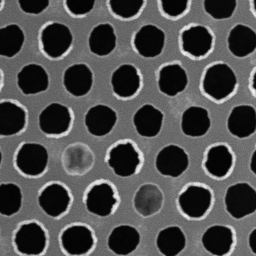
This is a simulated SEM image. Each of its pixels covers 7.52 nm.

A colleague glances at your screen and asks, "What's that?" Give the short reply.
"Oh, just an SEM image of a regular array of holes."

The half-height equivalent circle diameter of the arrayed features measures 0.229 µm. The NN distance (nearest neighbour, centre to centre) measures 345 nm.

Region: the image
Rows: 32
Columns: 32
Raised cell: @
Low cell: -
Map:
@@----@@----@@----@@---@@@---@@@
@@@--@@@@--@@@---@@@@--@@@---@@@
@@@@@@@@@@@@@@@@@@@@@@@@@@@@@@@@
--@@@@--@@@@--@@@@--@@@@--@@@--@
---@@----@@---@@@----@@---@@@---
---@@----@@---@@@---@@@---@@@---
--@@@@--@@@@--@@@---@@@---@@@--@
@@@@@@@@@@@@@@@@@@@@@@@@@@@@@@@@
@@@--@@@@--@@@@--@@@---@@@---@@@
@@----@@---@@@---@@@---@@@---@@@
@@----@@---@@@---@@@---@@----@@@
@@@--@@@@--@@@---@@@--@@@@---@@@
@@@@@@@@@@@@@@@@@@@@@@@@@@@@@@@@
---@@@--@@@---@@@@-@@@@@-@@@@---
---@@----@@---@@@---@@@---@@@---
---@@----@@---@@@---@@@---@@----
--@@@@--@@@---@@@---@@@---@@@---
@@@@@@@@@@@@@@@@@@@@@@@@@@@@@@@@
@@@--@@@@@@@@@---@@@@--@@@@-@@@@
@@----@@@@@@@@---@@@---@@@---@@@
@@----@@@@@@@@---@@@---@@@---@@-
@@@--@@@@@@@@@---@@@---@@@--@@@@
@@@@@@@@@@@@@@@@@@@@@@@@@@@@@@@@
--@@@@--@@@@--@@@@@@@@@@-@@@@--@
---@@----@@---@@@@@@@@@---@@----
---@@----@@---@@@@@@@@----@@----
--@@@@--@@@@--@@@@@@@@@---@@@---
@@@@@@@@@@@@@@@@@@@@@@@@@@@@@@@@
@@@--@@@@--@@@---@@@@-@@@@---@@@
@@----@@---@@@---@@@---@@----@@-
@@----@@----@@---@@@---@@----@@-
@@@--@@@@--@@@--@@@@--@@@@--@@@@